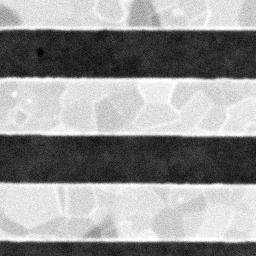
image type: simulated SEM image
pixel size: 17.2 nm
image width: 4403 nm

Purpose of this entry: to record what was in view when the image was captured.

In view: lines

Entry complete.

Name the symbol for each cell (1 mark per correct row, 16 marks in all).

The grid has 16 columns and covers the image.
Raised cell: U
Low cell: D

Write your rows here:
UUUUUUUUUUUUUUUU
UUUUUUUUUUUUUUUU
DDDDDDDDDDDDDDDD
DDDDDDDDDDDDDDDD
DDDDDDDDDDDDDDDD
UUUUUUUUUUUUUUUU
UUUUUUUUUUUUUUUU
UUUUUUUUUUUUUUUU
DDDDDDDDDDDDDDDD
DDDDDDDDDDDDDDDD
DDDDDDDDDDDDDDDD
DDDDDDDDDDDDDDDD
UUUUUUUUUUUUUUUU
UUUUUUUUUUUUUUUU
UUUUUUUUUUUUUUUU
DDDDDDDDDDDDDDDD